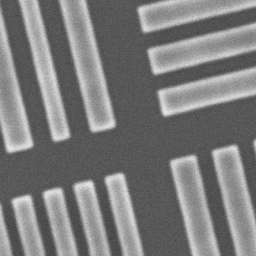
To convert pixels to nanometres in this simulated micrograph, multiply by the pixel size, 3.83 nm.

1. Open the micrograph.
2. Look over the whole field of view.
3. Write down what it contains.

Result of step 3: groups of lines, slits or small figures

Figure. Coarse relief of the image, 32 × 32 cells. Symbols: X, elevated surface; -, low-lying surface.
---XX---XXX--------XXXXXXXXXXXXX
---XX---XXX------XXXXXXXXXXXX---
---XX---XXX-------XXXXXX--------
X--XX---XXX-------XXX---------XX
X--XXX---XXX-------------XXXXXXX
X---XX---XXX---------XXXXXXXXXXX
X---XX---XXX-------XXXXXXXXXXXX-
X---XX---XXX-------XXXXXXXX-----
XX--XXX---XXX------XXX----------
XX---XX---XXX---------------XXXX
XX---XX---XXX-----------XXXXXXXX
XX---XX---XXX-------XXXXXXXXXXXX
XXX---XX--XXXX------XXXXXXXXX---
XXX---XX---XXX------XXXXX-------
XXX---XX---XXX------------------
XXX---XX---XXX------------------
XXXX--XXX-----------------------
-XXX----------------------------
-XX-------------------------X---
---------------------------XXX--
---------------------XXXX--XXX--
----------------------XXX--XXX--
-------------XXX------XXX--XXXX-
---------XXX-XXX------XXX---XXX-
------XX--XX--XX------XXXX--XXX-
--XX--XX--XX--XX-------XXX--XXX-
--XX--XX--XXX-XX-------XXX--XXXX
--XX--XXX-XXX-XXX------XXX---XXX
X-XXX-XXX-XXX--XX------XXXX--XXX
X--XX--XX--XX--XX------XXXX--XXX
X--XX--XX--XX--XXX------XXX--XXX
X--XXX-XXX-XXX-XXX------XXX--XXX